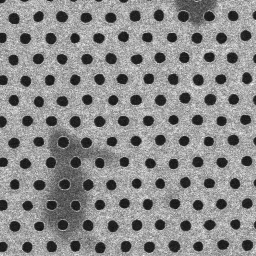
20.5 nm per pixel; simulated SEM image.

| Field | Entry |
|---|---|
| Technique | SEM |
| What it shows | a regular array of holes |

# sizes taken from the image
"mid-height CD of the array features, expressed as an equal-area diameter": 222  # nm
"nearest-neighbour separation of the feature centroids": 478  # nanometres